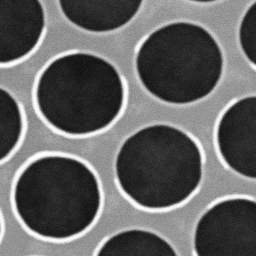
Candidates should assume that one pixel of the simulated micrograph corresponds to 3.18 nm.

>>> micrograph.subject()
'holes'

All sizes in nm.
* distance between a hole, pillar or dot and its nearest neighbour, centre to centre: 334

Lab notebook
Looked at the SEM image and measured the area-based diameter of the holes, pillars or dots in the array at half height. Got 0.265 micrometres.